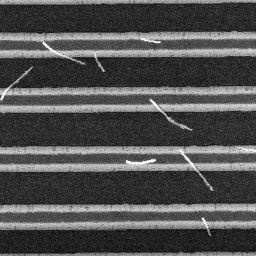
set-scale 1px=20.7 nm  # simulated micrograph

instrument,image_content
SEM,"lines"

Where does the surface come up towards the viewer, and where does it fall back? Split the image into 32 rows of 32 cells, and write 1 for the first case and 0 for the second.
00000000000000000000000000000000
00000000000000000000000000000000
00000000000000000000000000000000
00000000000000000000000000000000
00000001111111111111111111111111
11111111111111111111111111111111
11111111111111111111111111111111
00000000000000000000000000000000
00000000000000000000000000000000
00000000000000000000000000000000
00000000000000000000000000000000
11111111111111111111111111111111
11111111111111111111111111111111
11111111111111111111111111111111
00000000000000000000000000000000
00000000000000000000000000000000
00000000000000000000000000000000
00000000000000000000000000000000
00000000000000000000000000000000
11111111111111111111111111111111
11111111111111111111111111111111
00000000000000000000000000000000
00000000000000000000000000000000
00000000000000000000000000000000
00000000000000000000000000000000
00000000000000000000000000000000
11111111111111111111111111111111
11111111111111111111111111111111
00000000000000000000000000000000
00000000000000000000000000000000
00000000000000000000000000000000
00000000000000000000000000000000